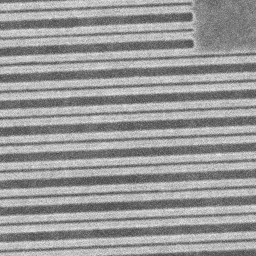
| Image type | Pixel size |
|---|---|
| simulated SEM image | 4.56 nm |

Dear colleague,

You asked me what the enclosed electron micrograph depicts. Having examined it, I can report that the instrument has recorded parallel lines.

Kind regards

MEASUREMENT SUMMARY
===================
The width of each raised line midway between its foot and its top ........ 0.0273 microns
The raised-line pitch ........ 60.5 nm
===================